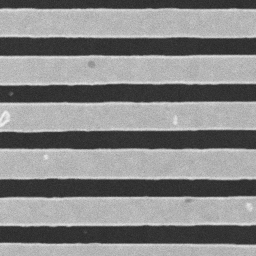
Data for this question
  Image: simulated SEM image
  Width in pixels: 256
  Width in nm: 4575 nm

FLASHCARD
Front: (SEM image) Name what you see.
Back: lines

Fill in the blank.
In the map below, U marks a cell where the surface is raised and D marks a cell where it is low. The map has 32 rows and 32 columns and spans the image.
DDDDDDDDDDDDDDDDDDDDDDDDDDDDDDDD
UUUUUUUUUUUUUUUUUUUUUUUUUUUUUUUU
UUUUUUUUUUUUUUUUUUUUUUUUUUUUUUUU
UUUUUUUUUUUUUUUUUUUUUUUUUUUUUUUU
UUUUUUUUUUUUUUUUUUUUUUUUUUUUUUUU
DDDDDDDDDDDDDDDDDDDDDDDDDDDDDDDD
DDDDDDDDDDDDDDDDDDDDDDDDDDDDDDDD
UUUUUUUUUUUUUUUUUUUUUUUUUUUUUUUU
UUUUUUUUUUUUUUUUUUUUUUUUUUUUUUUU
UUUUUUUUUUUUUUUUUUUUUUUUUUUUUUUU
UUUUUUUUUUUUUDDDDDDDDDDDDDDDDDDD
DDDDDDDDDDDDDDDDDDDDDDDDDDDDDDDD
DDDDDDDDDDDDDDDDDDDDDDDDDDDDDDDD
UUUUUUUUUUUUUUUUUUUUUUUUUUUUUUUU
UUUUUUUUUUUUUUUUUUUUUUUUUUUUUUUU
UUUUUUUUUUUUUUUUUUUUUUUUUUUUUUUU
DDDDDDDDDDDDDDDDDDDDDDDDDDDDDDDD
DDDDDDDDDDDDDDDDDDDDDDDDDDDDDDDD
DDDDDDDDDDDDDDDDDDDDDDDDDDDDDDDD
UUUUUUUUUUUUUUUUUUUUUUUUUUUUUUUU
UUUUUUUUUUUUUUUUUUUUUUUUUUUUUUUU
UUUUUUUUUUUUUUUUUUUUUUUUUUUUUUUU
DDDDDDDDDDDDDDDDDDDDDDDDDDDDDDDD
DDDDDDDDDDDDDDDDDDDDDDDDDDDDDDDD
DDDDDDDDDDDDDDDDDDDDDDDDDDDDDDDD
UUUUUUUUUUUUUUUUUUUUUUUUUUUUUUUU
UUUUUUUUUUUUUUUUUUUUUUUUUUUUUUUU
UUUUUUUUUUUUUUUUUUUUUUUUUUUUUUUU
DDDDDDDDDDDDDDDDDDDDDDDDDDDDDDDD
DDDDDDDDDDDDDDDDDDDDDDDDDDDDDDDD
UUUDUDDDDDDUUDDDDDDDDDDDDDDDDDDD
UUUUUUUUUUUUUUUUUUUUUUUUUUUUUUUU